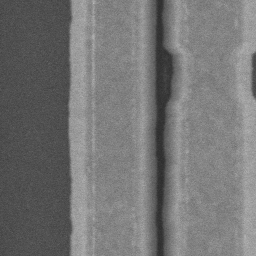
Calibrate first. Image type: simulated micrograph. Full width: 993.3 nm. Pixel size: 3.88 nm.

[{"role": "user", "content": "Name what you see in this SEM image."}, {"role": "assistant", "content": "one or a few lines or trenches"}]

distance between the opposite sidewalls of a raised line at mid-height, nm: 280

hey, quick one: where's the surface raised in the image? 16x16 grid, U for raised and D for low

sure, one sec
DDDDDUUUUDDUUUUU
DDDDDUUUUDDUUUUU
DDDDDUUUUDDUUUUU
DDDDDUUUUDDUUUUD
DDDDDUUUUDDUUUUD
DDDDDUUUUDDUUUUD
DDDDDUUUUDDUUUUU
DDDDDUUUUDDUUUUU
DDDDDUUUUDDUUUUU
DDDDDUUUUDDUUUUU
DDDDDUUUUDDUUUUU
DDDDDUUUUDDUUUUU
DDDDDUUUUDDUUUUU
DDDDDUUUUDDUUUUU
DDDDDUUUUDDUUUUU
DDDDDUUUUDDUUUUU